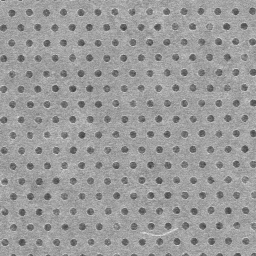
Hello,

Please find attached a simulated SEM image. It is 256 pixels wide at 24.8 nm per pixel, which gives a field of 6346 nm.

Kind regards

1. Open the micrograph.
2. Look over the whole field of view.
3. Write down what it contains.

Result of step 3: a regular array of holes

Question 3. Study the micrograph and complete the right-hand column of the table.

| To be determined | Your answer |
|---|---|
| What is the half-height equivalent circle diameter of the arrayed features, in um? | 0.188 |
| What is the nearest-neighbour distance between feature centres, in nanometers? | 422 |